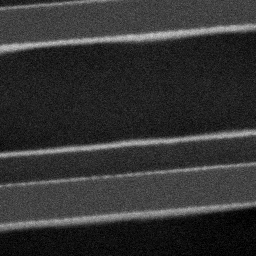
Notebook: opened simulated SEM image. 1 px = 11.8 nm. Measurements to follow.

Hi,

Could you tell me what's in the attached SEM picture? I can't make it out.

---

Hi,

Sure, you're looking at lines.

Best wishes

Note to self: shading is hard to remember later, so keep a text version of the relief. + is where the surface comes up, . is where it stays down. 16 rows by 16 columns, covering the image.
++++++++++++++++
++++++++++++++++
+++++...........
................
................
................
................
................
...............+
....++++++++++++
++++++++++++++++
++++++++++++++++
++++++++++++++++
+++++++.........
................
................